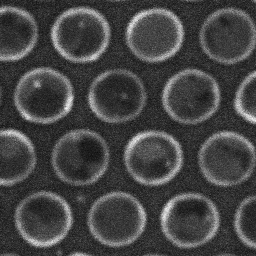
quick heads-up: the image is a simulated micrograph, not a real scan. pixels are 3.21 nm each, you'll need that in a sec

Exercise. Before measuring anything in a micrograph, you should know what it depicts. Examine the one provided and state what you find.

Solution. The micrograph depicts a regular array of raised bodies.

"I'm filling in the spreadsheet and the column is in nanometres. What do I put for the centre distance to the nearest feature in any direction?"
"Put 230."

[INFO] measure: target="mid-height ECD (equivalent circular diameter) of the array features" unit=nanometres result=173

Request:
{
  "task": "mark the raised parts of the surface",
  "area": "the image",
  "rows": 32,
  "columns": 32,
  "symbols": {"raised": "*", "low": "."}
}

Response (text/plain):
................................
***......***......***......***..
****...******....*****....*****.
****...******...*******..*******
****...******...*******..*******
****...******...*******..*******
***....******....*****....*****.
**........*.......**.......***..
................................
...*****.....****.....****.....*
..*******...******...******...**
..*******..*******...******...**
..*******..*******..*******..***
..*******...******...******..***
...*****....*****.....****....**
................................
**.......**.....................
***.....*****....*****....*****.
****...******...******...*******
****...******...*******..*******
****...******...*******..*******
****...******...******...******.
***.....****.....****.....****..
................................
....***......***.......**.......
...*****....*****....*****....**
..*******..*******...******...**
..*******..*******..*******..***
..*******..*******..*******..***
...*****....*****....*****....**
....***......***......***......*
................................